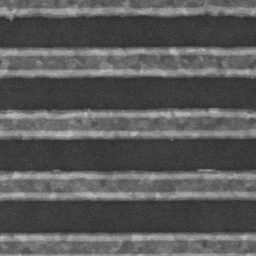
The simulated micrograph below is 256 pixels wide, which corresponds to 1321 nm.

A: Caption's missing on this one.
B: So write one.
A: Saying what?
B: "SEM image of one or a few lines or trenches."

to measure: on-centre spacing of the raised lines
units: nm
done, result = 318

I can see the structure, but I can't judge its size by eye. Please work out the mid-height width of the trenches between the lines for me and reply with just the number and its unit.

217 nanometers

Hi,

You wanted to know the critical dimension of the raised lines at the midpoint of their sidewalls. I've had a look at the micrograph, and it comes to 101 nm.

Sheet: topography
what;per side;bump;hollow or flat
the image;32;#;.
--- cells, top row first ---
################################
####..###...........#...........
................................
................................
................................
................................
.................#####..###....#
################################
################################
................................
................................
................................
................................
................................
.######.########################
################################
################################
................................
................................
................................
................................
................................
################################
################################
................................
................................
................................
................................
................................
................................
################################
################################